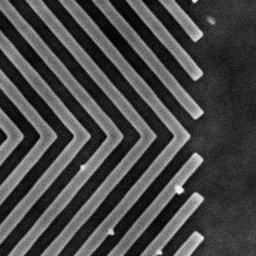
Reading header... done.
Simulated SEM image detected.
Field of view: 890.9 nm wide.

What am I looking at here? groups of lines, slits or small figures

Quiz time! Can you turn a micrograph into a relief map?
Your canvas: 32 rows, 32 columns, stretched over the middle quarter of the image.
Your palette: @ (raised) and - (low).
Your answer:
----@@@@-----@@@@----@@@@-----@@
@----@@@@-----@@@@----@@@@----@@
@@----@@@@-----@@@-----@@@@----@
@@-----@@@@----@@@@-----@@@@----
@@@-----@@@@----@@@@-----@@@----
@@@@-----@@@-----@@@@----@@@@---
-@@@@-----@@@-----@@@@----@@@@--
--@@@@----@@@@-----@@@@----@@@@-
---@@@@----@@@@----@@@@-----@@@@
----@@@@----@@@@-----@@@-----@@@
----@@@@@----@@@@----@@@@-----@@
@-----@@@-----@@@@----@@@@----@@
@@----@@@@-----@@@-----@@@@----@
@@@----@@@@-----@@@-----@@@@----
@@@@----@@@@----@@@@-----@@@@---
@@@@-----@@@@----@@@@-----@@@---
-@@@@-----@@@@----@@@@----@@@@--
--@@@@-----@@@-----@@@@----@@@@-
--@@@@@----@@@@----@@@@----@@@@-
--@@@@----@@@@----@@@@-----@@@--
-@@@@----@@@@-----@@@-----@@@@--
@@@@----@@@@-----@@@@----@@@@---
@@@-----@@@-----@@@@----@@@@----
@@-----@@@-----@@@@----@@@@-----
@@----@@@@----@@@@----@@@@-----@
@---@@@@@----@@@@----@@@@-----@@
----@@@@----@@@@-----@@@@----@@@
---@@@@-----@@@@----@@@@----@@@@
--@@@@-----@@@@----@@@@----@@@@-
--@@@-----@@@@----@@@@----@@@@--
-@@@-----@@@@----@@@@-----@@@---
@@@@----@@@@----@@@@-----@@@@@--